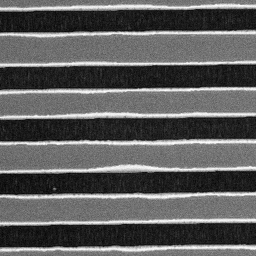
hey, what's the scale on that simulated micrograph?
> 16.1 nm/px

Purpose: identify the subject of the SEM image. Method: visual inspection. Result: lines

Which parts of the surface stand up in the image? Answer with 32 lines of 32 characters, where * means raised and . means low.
********************************
................................
................................
................................
********************************
********************************
********************************
********************************
................................
................................
................................
********************************
********************************
********************************
***********************.........
................................
................................
................................
********************************
********************************
********************************
*********.......................
................................
................................
********************************
********************************
********************************
********************************
................................
................................
................................
********************************